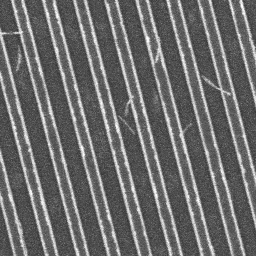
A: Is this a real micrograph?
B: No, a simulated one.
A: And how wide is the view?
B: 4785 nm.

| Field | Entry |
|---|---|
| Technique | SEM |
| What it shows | parallel lines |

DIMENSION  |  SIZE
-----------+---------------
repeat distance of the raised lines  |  563 nanometres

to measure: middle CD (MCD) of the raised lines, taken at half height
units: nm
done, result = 220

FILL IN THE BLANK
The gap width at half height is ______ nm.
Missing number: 346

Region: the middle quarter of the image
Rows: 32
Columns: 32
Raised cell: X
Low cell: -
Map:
XX-----XXX----XXX-----XXX-----XX
XX-----XXX-----XX------XX-----XX
XX-----XXX-----XXX-----XXX-----X
XXX----XXX-----XXX-----XXX-----X
XXX-----XXX----XXX-----XXX-----X
XXX-----XXX-----XXX-----XX-----X
-XX-----XXX-----XXX-----XXX-----
-XXX----XXX-----XXX-----XXX-----
-XXX-----XXX----XXX-----XXX-----
-XXX-----XXX-----XXX-----XX-----
--XX-----XXX-----XXX-----XXX----
--XXX----XXX-----XXX-----XXX----
--XXX-----XXX-----XX-----XXX----
--XXX-----XXX-----XXX-----XX----
---XX-----XXX-----XXX-----XXX---
---XXX-----XX-----XXX-----XXX---
---XXX-----XXX-----XX-----XXX---
---XXX-----XXX-----XXX-----XX---
----XX-----XXX-----XXX-----XXX--
----XXX-----XXX----XXX-----XXX--
----XXX-----XXX-----XX-----XXX--
----XXX-----XXX-----XXX-----XX--
-----XX-----XXX-----XXX-----XXX-
-----XXX-----XXX----XXX-----XXX-
-----XXX-----XXX-----XX-----XXX-
-----XXX-----XXX-----XXX-----XX-
------XX-----XXX-----XXX-----XXX
X-----XXX-----XXX----XXX-----XXX
X-----XXX-----XXX-----XX-----XXX
X------XX-----XXX-----XXX-----XX
XX-----XXX----XXX-----XXX-----XX
XX-----XXX-----XXX----XXX-----XX